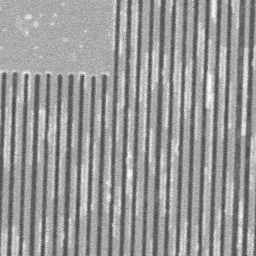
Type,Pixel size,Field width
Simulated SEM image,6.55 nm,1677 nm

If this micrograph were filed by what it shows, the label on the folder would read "parallel lines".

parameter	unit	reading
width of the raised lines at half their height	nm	37.7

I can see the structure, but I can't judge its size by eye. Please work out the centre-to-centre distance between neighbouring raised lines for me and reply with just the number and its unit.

73.6 nanometers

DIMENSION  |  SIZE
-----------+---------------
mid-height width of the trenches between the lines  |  31.9 nm